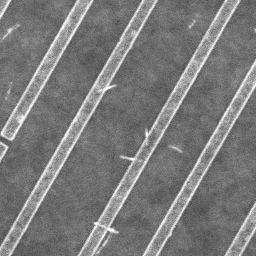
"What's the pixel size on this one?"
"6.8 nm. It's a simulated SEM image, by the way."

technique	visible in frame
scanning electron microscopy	parallel lines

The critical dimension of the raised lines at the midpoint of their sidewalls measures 85.4 nanometres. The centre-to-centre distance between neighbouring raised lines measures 0.431 um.